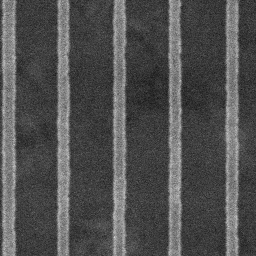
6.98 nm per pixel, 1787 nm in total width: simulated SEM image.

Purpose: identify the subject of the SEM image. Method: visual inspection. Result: lines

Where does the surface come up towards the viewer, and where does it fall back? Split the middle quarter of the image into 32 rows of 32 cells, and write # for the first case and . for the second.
#............##............##...
#............##............##...
#............##............##...
#............##............##...
#............##............##...
#............##............##...
#............##............##...
#............##............##...
#............##............##...
#............##............##...
#............##............##...
#............##............##...
#............##............##...
#............##............##...
#............##............##...
#............##............##...
#............##............##...
#............##............##...
#............##............##...
#............##............##...
#............##............##...
#............##............##...
#............##............##...
#............##............##...
#............##............##...
#............##............##...
#............##............##...
#............##............##...
#............##............##...
#............##............##...
#............##............##...
#............##............##...